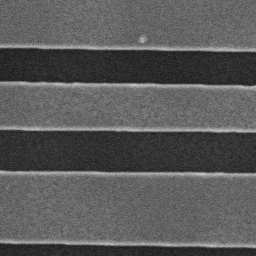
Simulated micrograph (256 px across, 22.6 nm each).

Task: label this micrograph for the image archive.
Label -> lines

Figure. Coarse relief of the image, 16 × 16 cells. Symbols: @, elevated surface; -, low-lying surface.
@@@@@@@@@@@@@@@@
@@@@@@@@@@@@@@@@
@@@@@@@@@@@@@@@@
----------------
----------------
@@@@@@@@@@@@@@@@
@@@@@@@@@@@@@@@@
@@@@@@@@@@@@@@@@
----------------
----------------
----------------
@@@@@@@@@@@@@@@@
@@@@@@@@@@@@@@@@
@@@@@@@@@@@@@@@@
@@@@@@@@@@@@@@@@
----------------